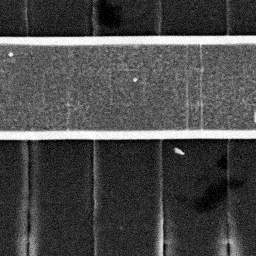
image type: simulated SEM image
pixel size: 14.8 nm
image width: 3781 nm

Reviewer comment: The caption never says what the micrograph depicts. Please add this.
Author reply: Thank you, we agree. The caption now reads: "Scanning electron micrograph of wiring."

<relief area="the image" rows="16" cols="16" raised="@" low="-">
----------------
----------------
---------------@
@@@@@@@@@@@@@@@@
@@@@@@@@@@@@@@@@
@@@@@@@@@@@@@@@@
@@@@@@@@@@@@@@@@
@@@@@@@@@@@@@@@@
----------------
----------------
----------------
----------------
----------------
----------------
----------------
----------------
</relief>